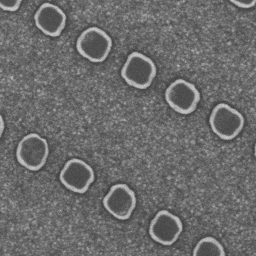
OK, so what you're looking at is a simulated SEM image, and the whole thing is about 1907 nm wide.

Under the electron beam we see a regular array of raised bodies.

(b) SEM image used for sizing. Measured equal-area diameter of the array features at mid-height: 226 nm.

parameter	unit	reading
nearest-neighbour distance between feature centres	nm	376